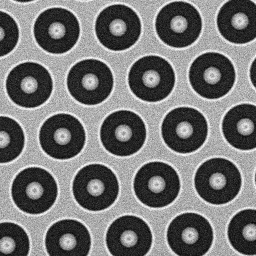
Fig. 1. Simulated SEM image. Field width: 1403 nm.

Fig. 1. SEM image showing an array of small figures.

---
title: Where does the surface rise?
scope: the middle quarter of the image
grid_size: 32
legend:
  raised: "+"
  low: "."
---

++.........++++++..........+++++
+...........++++...........++++.
+...........++++.....++.....+++.
+.....+......+++.....++.....+++.
.....+++.....+++.....++.....+++.
+.....+.....++++............++++
+...........+++++..........+++++
++..........+++++..........+++++
++.........+++++++.......+++++++
++++......+++++++++++..+++++++++
++++++.+++++++++++++++++++++++++
+++++++++++++...+++++++++++.....
.++++++++++.......++++++++......
...+++++++.........++++++.......
....++++++..........+++++.......
.....++++...........++++.....++.
.....++++.....++.....+++.....++.
+....++++.....++.....+++.....++.
+.....+++............+++........
.....++++...........+++++.......
.....+++++..........++++++......
.....++++++........++++++++.....
....++++++++......++++++++++++++
..++++++++++++++++++++++++++++++
+++++++++++++++++++++....+++++++
+++++......+++++++++.......+++++
++++........++++++..........++++
+++..........+++++...........+++
++...........++++............+++
++............+++.....++.....+++
++.....++.....+++.....++.....+++
++.....++.....+++............+++